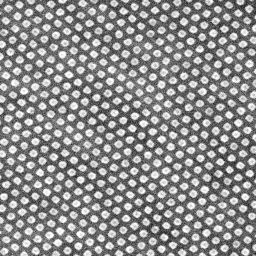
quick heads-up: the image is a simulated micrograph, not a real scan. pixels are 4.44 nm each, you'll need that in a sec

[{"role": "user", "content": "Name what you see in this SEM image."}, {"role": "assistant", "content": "a regular array of raised bodies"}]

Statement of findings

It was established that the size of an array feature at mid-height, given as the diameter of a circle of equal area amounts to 27.9 nm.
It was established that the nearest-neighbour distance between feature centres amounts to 51.7 nanometers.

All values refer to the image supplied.